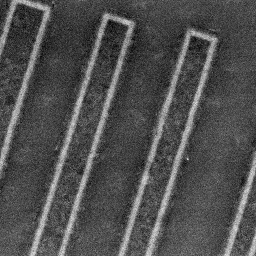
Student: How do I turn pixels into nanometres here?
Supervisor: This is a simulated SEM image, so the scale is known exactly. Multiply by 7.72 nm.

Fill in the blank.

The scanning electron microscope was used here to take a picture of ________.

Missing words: one or a few lines or trenches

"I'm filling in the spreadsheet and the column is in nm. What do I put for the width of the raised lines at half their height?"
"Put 210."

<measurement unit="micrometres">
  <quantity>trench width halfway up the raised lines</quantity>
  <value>0.442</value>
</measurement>